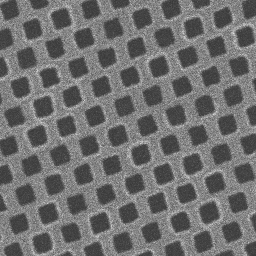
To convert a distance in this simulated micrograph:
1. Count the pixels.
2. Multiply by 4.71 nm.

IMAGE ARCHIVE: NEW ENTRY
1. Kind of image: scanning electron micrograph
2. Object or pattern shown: a regular array of holes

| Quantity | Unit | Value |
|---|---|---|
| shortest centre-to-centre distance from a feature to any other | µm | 0.139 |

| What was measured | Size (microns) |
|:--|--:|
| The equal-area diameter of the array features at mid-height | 0.0936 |